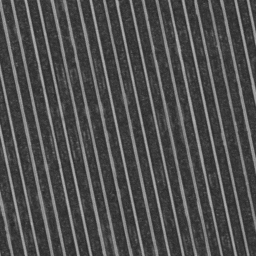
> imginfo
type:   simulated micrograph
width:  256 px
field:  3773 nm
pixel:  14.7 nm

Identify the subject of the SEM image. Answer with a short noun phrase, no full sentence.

parallel lines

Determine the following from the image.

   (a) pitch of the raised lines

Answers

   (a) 189 nanometres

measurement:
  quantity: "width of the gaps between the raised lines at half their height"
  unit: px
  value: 10.5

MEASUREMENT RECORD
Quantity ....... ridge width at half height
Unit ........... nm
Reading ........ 25.3